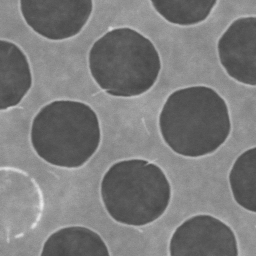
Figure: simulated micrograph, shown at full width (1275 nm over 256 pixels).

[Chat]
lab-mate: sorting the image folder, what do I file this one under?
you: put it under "holes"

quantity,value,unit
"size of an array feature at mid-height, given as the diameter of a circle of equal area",0.344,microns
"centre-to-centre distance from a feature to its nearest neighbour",455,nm